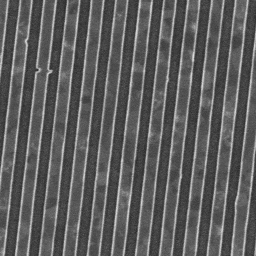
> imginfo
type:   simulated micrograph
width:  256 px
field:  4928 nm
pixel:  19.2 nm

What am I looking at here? parallel lines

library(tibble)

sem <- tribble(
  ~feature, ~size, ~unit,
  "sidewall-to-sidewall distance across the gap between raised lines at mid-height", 227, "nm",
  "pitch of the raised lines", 458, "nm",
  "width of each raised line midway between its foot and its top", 227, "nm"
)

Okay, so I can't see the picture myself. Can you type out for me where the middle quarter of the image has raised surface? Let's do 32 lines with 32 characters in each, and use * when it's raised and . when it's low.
**...***...***...***...***...***
**...***...***...***...***...***
**...***...***...***...***...***
**...***...***...***...***...***
**...***...***...***...***...***
*....**....***...***...**....**.
*...***...***....***...**....**.
*...***...***...****..***...***.
*...***...***...***...***...***.
*...***...***...***...***...***.
*...***...***...***...***...***.
*...***...***...***...***...***.
*...***...***...***...***...***.
*...***...**....***...***...***.
....***...**....***...**....**..
...****..***....**....***...**..
...***...***...***...***...***..
...***...***...***...***...***..
...***...***...***...***...***..
...***...***...***...***...***..
...***...***...***...***...***..
...***...***...***...***...***..
...***...**....***...***...***..
...**....**....***...**....**...
..***...***....**....**....**...
..***...***...***...***...***...
..***...***...***...***...***...
..***...***...***...***...***...
..***...***...***...***...***...
..***...***...***...***...***...
..***...***...***...***...***...
..***...**....***...***...***...